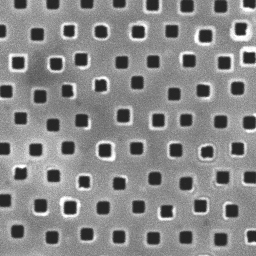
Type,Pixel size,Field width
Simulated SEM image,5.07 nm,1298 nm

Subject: a regular array of holes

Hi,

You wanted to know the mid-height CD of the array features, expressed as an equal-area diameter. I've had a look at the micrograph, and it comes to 73.3 nm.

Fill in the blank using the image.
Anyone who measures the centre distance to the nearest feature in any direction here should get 29.7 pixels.